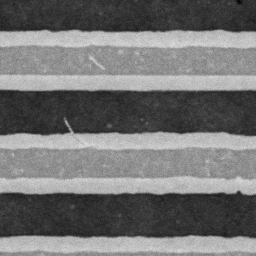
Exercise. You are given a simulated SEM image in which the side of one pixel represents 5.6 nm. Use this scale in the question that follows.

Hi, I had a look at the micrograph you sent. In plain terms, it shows one or a few lines or trenches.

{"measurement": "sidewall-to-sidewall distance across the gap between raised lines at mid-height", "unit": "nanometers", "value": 338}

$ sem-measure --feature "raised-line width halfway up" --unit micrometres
0.238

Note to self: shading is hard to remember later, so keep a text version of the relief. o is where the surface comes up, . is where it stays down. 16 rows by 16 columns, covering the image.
................
................
ooo.oooo.o..oo.o
oooooooooooooooo
oooooooooooooooo
................
................
................
................
oooooooooooooooo
oooooooooooooooo
ooooooooooo.oooo
................
................
................
oooooooooooooooo